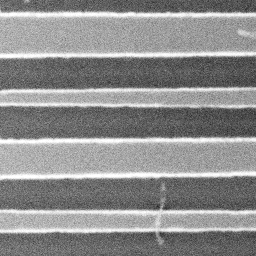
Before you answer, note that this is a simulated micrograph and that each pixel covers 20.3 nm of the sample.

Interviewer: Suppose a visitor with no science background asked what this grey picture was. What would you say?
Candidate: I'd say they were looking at lines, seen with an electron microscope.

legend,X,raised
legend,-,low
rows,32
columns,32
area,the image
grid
--------------------------------
--------------------------------
XXXXXXXXXXXXXXXXXXXXXXXXXXXXXXXX
XXXXXXXXXXXXXXXXXXXXXXXXXXXXXXXX
XXXXXXXXXXXXXXXXXXXXXXXXXXXXXXXX
XXXXXXXXXXXXXXXXXXXXXXXXXXXXXXXX
XXXXXXXXXXXXXXXXXXXXXXXXXXXXXXXX
--------------------------------
--------------------------------
--------------------------------
--------------------------------
XXXXXXXXXXXXXXXXXXXXXXXXXXXXXXXX
XXXXXXXXXXXXXXXXXXXXXXXXXXXXXXXX
--------------------------------
--------------------------------
--------------------------------
--------------------------------
-----------XX--XXXXXXXXXXXXXXXXX
XXXXXXXXXXXXXXXXXXXXXXXXXXXXXXXX
XXXXXXXXXXXXXXXXXXXXXXXXXXXXXXXX
XXXXXXXXXXXXXXXXXXXXXXXXXXXXXXXX
XXXXXXXXXXXXXXXXXXXXXXXXXXXXXXXX
--------------------------------
--------------------------------
--------------------------------
--------------------------------
XXXXXXXXXXXXXXXXXXXXXXXXXXXXXXXX
XXXXXXXXXXXXXXXXXXXXXXXXXXXXXXXX
XXXXXXXXXXXXXXXXXXXXXXXXXXXXXXXX
--------------------------------
--------------------------------
--------------------------------